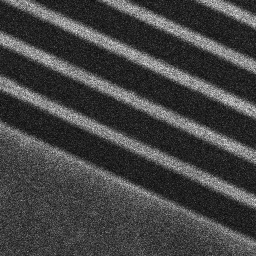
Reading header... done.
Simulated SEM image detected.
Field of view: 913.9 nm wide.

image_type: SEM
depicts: parallel lines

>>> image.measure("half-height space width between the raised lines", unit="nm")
111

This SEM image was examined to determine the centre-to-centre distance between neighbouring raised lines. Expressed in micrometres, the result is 0.146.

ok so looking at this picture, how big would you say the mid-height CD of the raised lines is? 35.6 nanometres